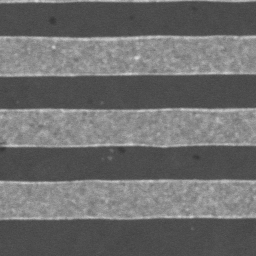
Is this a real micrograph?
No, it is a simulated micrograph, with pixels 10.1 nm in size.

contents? wiring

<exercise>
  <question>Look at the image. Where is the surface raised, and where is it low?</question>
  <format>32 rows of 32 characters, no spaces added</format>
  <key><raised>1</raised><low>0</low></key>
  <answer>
00000000000000000000000000000000
00000000000000000000000000000000
00000000000000000000000000000000
00000000000000000000000000000000
00000000000000000000000000000000
11111111111111111111111111111111
11111111111111111111111111111111
11111111111111111111111111111111
11111111111111111111111111111111
00000000000000000000000000000000
00000000000000000000000000000000
00000000000000000000000000000000
00000000000000000000000000000000
00000000000000000000000000000000
11111111111111111111111111111111
11111111111111111111111111111111
11111111111111111111111111111111
11111111111111111111111111111111
00000000000000000000000000000000
00000000000000000000000000000000
00000000000000000000000000000000
00000000000000000000000000000000
00000000000000000000000000000000
11111111111111111111111111111111
11111111111111111111111111111111
11111111111111111111111111111111
11111111111111111111111111111111
00000000000000000000000000000000
00000000000000000000000000000000
00000000000000000000000000000000
00000000000000000000000000000000
00000000000000000000000000000000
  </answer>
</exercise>